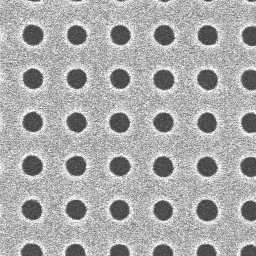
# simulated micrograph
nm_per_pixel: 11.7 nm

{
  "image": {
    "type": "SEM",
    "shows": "a regular array of holes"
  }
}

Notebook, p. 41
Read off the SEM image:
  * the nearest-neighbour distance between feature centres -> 507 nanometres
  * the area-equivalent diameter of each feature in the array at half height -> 243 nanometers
